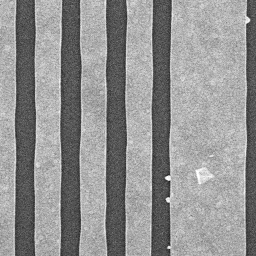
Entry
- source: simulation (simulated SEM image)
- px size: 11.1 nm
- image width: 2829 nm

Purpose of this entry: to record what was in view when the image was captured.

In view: groups of lines, slits or small figures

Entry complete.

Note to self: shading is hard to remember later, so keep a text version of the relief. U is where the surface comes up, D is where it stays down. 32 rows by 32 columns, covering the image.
UUDDUUUUDDUUUDDDUUUDDDUUUUUUUUUD
UUDDUUUUDDUUUDDDUUUDDDUUUUUUUUUD
UUDDUUUUDDUUUDDDUUUDDDUUUUUUUUUD
UUDDDUUUDDUUUDDDUUUDDUUUUUUUUUUD
UUDDDUUUDDUUUDDDUUUDDUUUUUUUUUUD
UUDDUUUUDDUUUDDDUUUDDUUUUUUUUUUD
UUDDUUUDDDUUUDDDUUUDDUUUUUUUUUUD
UUDDUUUDDDUUUDDDUUUDDUUUUUUUUUUD
UUDDUUUDDDUUUDDDUUUDDUUUUUUUUUUD
UUDDUUUDDDUUUDDDUUUDDUUUUUUUUUUD
UUDDUUUDDDUUUDDDUUUDDUUUUUUUUUUD
UUDDUUUDDDUUUDDDUUUDDUUUUUUUUUUD
UUDDUUUDDDUUUDDDUUUDDUUUUUUUUUUD
UUDDDUUDDDUUUDDDUUUDDUUUUUUUUUUD
UUDDDUUDDDUUUDDDUUUDDUUUUUUUUUUD
UUDDDUUDDDUUUDDDUUUDDUUUUUUUUUUD
UUDDDUUDDDUUUDDDUUUDDUUUUUUUUUUD
UUDDDUUDDDUUUDDDUUUDDUUUUUUUUUUD
UUDDUUUUDDUUUDDDUUUDDUUUUUUUUUUD
UUDDUUUUDDUUUDDDUUUDDUUUUUUUUUUD
UUDDUUUUDDUUUDDDUUUDDUUUUUUUUUUD
UUDDUUUUDDUUUDDDUUUDDUUUUUUUUUUD
UUDDUUUUDDUUUDDDUUUDDUUUUUUUUUUD
UUDDUUUUDDUUUDDDUUUDDUUUUUUUUUUD
UUDDUUUDDDUUUDDDUUUDDUUUUUUUUUUD
UUDDUUUDDDUUUDDDUUUDDUUUUUUUUUUD
UUDDUUUDDDUUUDDDUUUDDUUUUUUUUUUD
UUDDUUUDDDUUUDDDUUUDDUUUUUUUUUUD
UUDDUUUUDDUUUDDDUUUDDUUUUUUUUUUD
UUDDUUUUDDUUUDDDUUUDDUUUUUUUUUUD
UUDDUUUDDDUUUDDDUUUDDUUUUUUUUUUD
UUDDUUUDDDUUUDDDUUUDDUUUUUUUUUUD